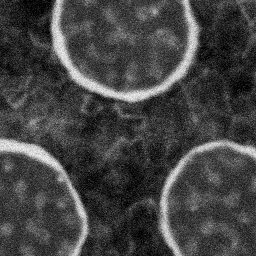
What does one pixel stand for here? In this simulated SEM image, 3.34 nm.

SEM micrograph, raised bodies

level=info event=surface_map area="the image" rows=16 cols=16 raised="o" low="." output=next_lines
...ooooooooo....
...ooooooooo....
....oooooooo....
....oooooooo....
....ooooooo.....
......oooo......
................
................
................
oo..........oooo
oooo.......ooooo
oooo......oooooo
ooooo.....oooooo
ooooo.....oooooo
ooooo.....oooooo
ooooo......ooooo